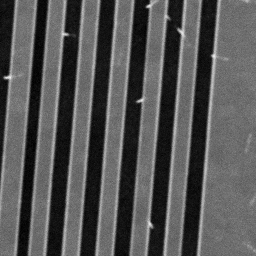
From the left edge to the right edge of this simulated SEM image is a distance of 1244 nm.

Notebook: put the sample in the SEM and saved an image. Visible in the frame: parallel lines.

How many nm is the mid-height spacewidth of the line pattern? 84.8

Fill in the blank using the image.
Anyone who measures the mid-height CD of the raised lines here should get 80.5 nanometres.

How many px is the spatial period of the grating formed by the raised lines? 33.4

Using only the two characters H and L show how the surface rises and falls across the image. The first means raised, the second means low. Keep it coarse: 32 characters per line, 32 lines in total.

LLHHLLHHLLHHLLLHHLLHHLLHHLLHHHHH
LLHHLLHHLLHHLLLHHLLHHLLHHLLHHHHH
LLHHLLHHLLHHLLHHLLLHHLLHHLLHHHHH
LLHHLLHHLLHHLLHHLLLHHLLHHLLHHHHH
LLHHLLHHLLHHLLHHLLLHLLLHHLLHHHHH
LLHHLLHHLLHHLLHHLLHHLLLHHLLHHHHH
LLHHLLHHLLHHLLHHLLHHLLLHHLLHHHHH
LHHHLLHHLLHHLLHHLLHHLLLHHLLHHHHH
LHHHLLHHLLHHLLHHLLHHLLLHLLLHHHHH
LHHHLHHLLLHHLLHHLLHHLLHHLLLHHHHH
LHHHLHHLLLHHLLHHLLHHLLHHLLLHHHHH
LHHHLHHLLLHLLLHHLLHHLLHHLLHHHHHH
LHHHLHHLLHHLLLHHLLHHLLHHLLHHHHHH
LHHLLHHLLHHLLLHHLLHHLLHHLLHHHHHH
LHHLLHHLLHHLLHHHLLHHLLHHLLHHHHHH
LHHLLHHLLHHLLHHLLLHHLLHHLLHHHHHH
LHHLLHHLLHHLLHHLLLHHLLHHLLHHHHHH
LHHLLHHLLHHLLHHLLLHLLLHHLLHHHHHH
LHHLLHHLLHHLLHHLLHHLLLHHLLHHHHHH
HHHLLHHLLHHLLHHLLHHLLLHHLLHHHHHH
HHHLLHLLLHHLLHHLLHHLLLHLLLHHHHHH
HHHLHHLLLHHLLHHLLHHLLHHLLLHHHHHH
HHHLHHLLLHHLLHHLLHHLLHHLLLHHHHHH
HHHLHHLLLHHLLHHLLHHLLHHLLHHHHHHH
HHHLHHLLLHLLLHHLLHHLLHHLLHHHHHHH
HHLLHHLLHHLLLHHLLHHLLHHLLHHHHHHH
HHLLHHLLHHLLLHHLLHHLLHHLLHHHHHHH
HHLLHHLLHHLLHHLLLHHLLHHLLHHHHHHH
HHLLHHLLHHLLHHLLLHHLLHHLLHHHHHHH
HHLLHHLLHHLLHHLLLHLLLHHLLHHHHHHH
HHLLHHLLHHLLHHLLHHLLLHHLLHHHHHHH
HHLLHHLLHHLLHHLLHHLLLHHLLHHHHHHH